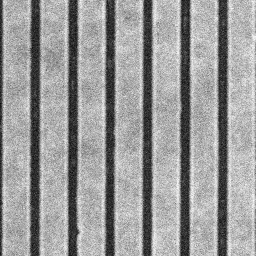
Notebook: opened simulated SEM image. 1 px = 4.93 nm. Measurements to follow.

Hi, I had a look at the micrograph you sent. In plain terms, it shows parallel lines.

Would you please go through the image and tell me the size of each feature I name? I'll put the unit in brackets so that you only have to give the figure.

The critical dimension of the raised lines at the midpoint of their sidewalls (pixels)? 25.9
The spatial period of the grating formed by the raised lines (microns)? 0.185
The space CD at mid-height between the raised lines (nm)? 56.7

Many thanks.